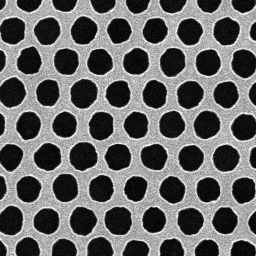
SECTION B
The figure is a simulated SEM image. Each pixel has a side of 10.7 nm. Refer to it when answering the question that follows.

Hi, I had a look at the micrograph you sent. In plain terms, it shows a regular array of holes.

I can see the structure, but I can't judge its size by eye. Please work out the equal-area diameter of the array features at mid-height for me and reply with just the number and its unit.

280 nm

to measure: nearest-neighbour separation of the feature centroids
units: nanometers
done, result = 375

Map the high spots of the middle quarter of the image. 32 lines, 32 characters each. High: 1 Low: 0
00011100000011100000011100000011
00011100000011100000011100000011
00111111001111111001111110000111
11111111111111111111111111111111
11100001111100001111100011111100
11000000111000001111000001111000
10000000111000001111000000110000
11000000110000000111000000110000
11000000111000000111000000110000
11000000111000001111000001111000
11100011111100011111100001111000
11111111111111111111111111111111
00111110000111111000111110000111
00011110000011100000011100000011
00011100000011100000011100000011
00011100000011100000011100000011
00011100000011100000011100000011
00011110000011110000011110000111
11111110000111111001111111001111
11111111111111111111111111111111
11000001111000001111100001111111
11000000111000001110000001111000
10000000110000000110000000111000
10000000110000000110000000110000
10000000111000000110000001111000
11000000111000001111000001111000
11100111111100111111110011111100
01111111111111111111111111111111
00011111000011111000111111000111
00011110000011100000011110000111
00001100000011100000011100000011
00001100000011100000011100000011